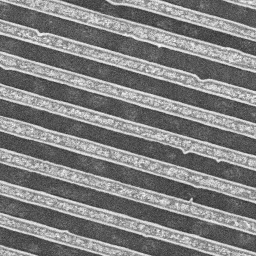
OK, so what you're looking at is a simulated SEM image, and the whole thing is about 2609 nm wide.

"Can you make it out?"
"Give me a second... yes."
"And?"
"parallel lines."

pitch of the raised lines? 316 nanometres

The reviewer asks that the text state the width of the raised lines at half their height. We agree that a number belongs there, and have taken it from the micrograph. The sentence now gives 132 nm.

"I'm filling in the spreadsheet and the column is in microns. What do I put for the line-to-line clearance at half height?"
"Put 0.18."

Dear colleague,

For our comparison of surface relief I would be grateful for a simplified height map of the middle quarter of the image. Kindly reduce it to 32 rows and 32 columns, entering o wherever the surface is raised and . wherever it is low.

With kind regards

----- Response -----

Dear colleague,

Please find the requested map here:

..............ooooooooooo.......
................oooooooooooo....
oooo................oooooooooooo
ooooooo................ooooooooo
oooooooooo.................ooooo
..oooooooooooo................oo
......oooooooooooo..............
.........oooooooooooo...........
.............oooooooooooo.......
................oooooooooooo....
ooo.................oooooooooooo
oooooo.................ooooooooo
oooooooooo.................ooooo
..ooooooooooo..................o
.....oooooooooooo...............
.........oooooooooooo...........
............oooooooooooo........
................oooooooooooo....
oooo................ooooooooooo.
ooooooo.................oooooooo
oooooooooo.................ooooo
..oooooooooooo...............ooo
....ooooooooooooo...............
.........oooooooooooo...........
............ooooooooooooo.......
................ooooooooooooo...
ooo................ooooooooooooo
ooooooo...............oooooooooo
oooooooooo................oooooo
.ooooooooooooo................oo
.....oooooooooooo...............
........ooooooooooooo...........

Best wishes